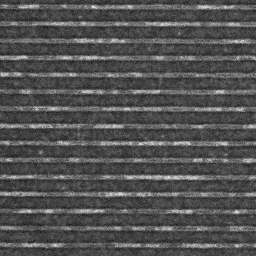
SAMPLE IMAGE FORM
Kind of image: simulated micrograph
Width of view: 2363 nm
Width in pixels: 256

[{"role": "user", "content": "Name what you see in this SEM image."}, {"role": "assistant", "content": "parallel lines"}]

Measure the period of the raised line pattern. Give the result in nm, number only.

157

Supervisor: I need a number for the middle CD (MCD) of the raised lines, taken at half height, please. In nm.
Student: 26.5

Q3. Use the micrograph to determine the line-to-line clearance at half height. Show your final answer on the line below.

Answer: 0.134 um